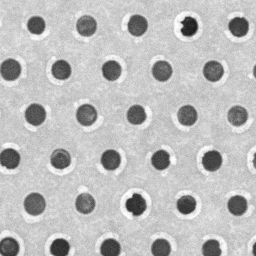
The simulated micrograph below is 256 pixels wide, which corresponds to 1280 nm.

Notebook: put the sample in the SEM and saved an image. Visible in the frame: a regular array of holes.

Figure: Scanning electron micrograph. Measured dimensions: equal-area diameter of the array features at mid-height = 109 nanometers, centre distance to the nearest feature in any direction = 253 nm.